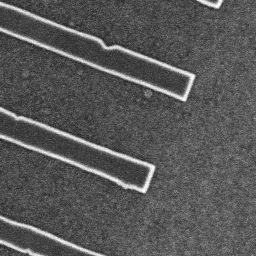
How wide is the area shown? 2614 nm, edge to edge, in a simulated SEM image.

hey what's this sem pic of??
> one or a few lines or trenches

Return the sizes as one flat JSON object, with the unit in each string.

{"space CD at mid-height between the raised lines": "758 nm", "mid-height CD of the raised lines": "25.7 pixels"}